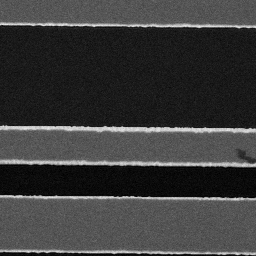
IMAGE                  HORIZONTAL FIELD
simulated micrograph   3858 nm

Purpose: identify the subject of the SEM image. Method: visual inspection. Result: lines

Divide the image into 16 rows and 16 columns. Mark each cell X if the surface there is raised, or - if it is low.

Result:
XXXXXXXXXXXXXXXX
XXXXXXXXXXXXXXXX
----------------
----------------
----------------
----------------
----------------
----------------
XXXXXXXXXXXXXXXX
XXXXXXXXXXXXXXXX
----------------
----------------
XXXXXXXXXXXXXXXX
XXXXXXXXXXXXXXXX
XXXXXXXXXXXXXXXX
XXXXXXXXXXXXXXXX